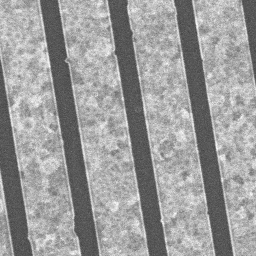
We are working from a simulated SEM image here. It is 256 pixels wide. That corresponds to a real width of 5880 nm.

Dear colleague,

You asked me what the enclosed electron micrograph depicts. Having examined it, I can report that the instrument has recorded one or a few lines or trenches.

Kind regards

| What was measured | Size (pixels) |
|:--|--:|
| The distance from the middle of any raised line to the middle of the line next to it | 66.4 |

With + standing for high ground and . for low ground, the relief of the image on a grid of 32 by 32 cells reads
+++++..++++++...++++++..++++++..
+++++...++++++..++++++..++++++..
+++++...++++++..++++++..++++++..
+++++...++++++..++++++...++++++.
++++++..++++++...+++++...++++++.
++++++..++++++...+++++...++++++.
++++++..++++++...++++++..++++++.
++++++..+++++++..++++++..++++++.
++++++...++++++..++++++..++++++.
.+++++...++++++..++++++...++++++
.++++++..++++++...+++++...++++++
.++++++..++++++...+++++...++++++
.++++++..++++++...++++++..++++++
.++++++...++++++..++++++..++++++
.++++++...++++++..++++++..++++++
.++++++...++++++..++++++...+++++
..++++++..++++++...+++++...+++++
..++++++..++++++...+++++...+++++
..++++++..++++++...++++++..+++++
..++++++...++++++..++++++..+++++
..++++++...++++++..++++++..+++++
..++++++...++++++..++++++...++++
...++++++..++++++..++++++...++++
...++++++..++++++...+++++...++++
...++++++..++++++...++++++..++++
+..++++++..++++++...++++++..++++
+..++++++...++++++..++++++..++++
+..++++++...++++++..++++++...+++
+..++++++...++++++..++++++...+++
+...++++++..++++++...+++++...+++
+...++++++..++++++...++++++..+++
++..++++++..++++++...++++++..+++